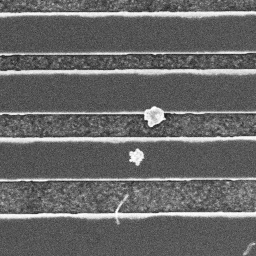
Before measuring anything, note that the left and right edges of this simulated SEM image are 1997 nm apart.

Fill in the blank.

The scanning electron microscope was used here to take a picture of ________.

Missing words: lines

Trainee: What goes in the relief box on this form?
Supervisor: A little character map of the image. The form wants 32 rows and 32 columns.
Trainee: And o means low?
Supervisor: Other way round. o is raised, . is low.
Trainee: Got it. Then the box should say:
................................
................................
oooooooooooooooooooooooooooooooo
oooooooooooooooooooooooooooooooo
oooooooooooooooooooooooooooooooo
oooooooooooooooooooooooooooooooo
oooooooooooooooooooooooooooooooo
................................
................................
oooooooooooooooooooooooooooooooo
oooooooooooooooooooooooooooooooo
oooooooooooooooooooooooooooooooo
oooooooooooooooooooooooooooooooo
oooooooooooooooooooooooooooooooo
..................ooo...........
................................
................................
oooooooooooooooooooooooooooooooo
oooooooooooooooooooooooooooooooo
oooooooooooooooooooooooooooooooo
oooooooooooooooooooooooooooooooo
oooooooooooooooooooooooooooooooo
oooooo..........................
................................
................................
................................
................................
oooooooooooooooooooooooooooooooo
oooooooooooooooooooooooooooooooo
oooooooooooooooooooooooooooooooo
oooooooooooooooooooooooooooooooo
oooooooooooooooooooooooooooooooo